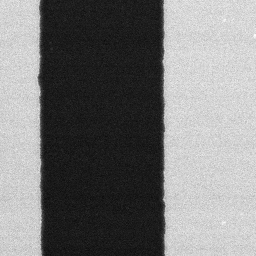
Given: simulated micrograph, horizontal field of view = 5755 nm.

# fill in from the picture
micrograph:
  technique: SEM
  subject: one or a few lines or trenches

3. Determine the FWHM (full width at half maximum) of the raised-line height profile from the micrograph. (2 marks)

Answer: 2.82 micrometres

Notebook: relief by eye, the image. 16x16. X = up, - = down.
--XXXXXXXX------
--XXXXXXXX------
--XXXXXXXX------
--XXXXXXXX------
--XXXXXXXX------
--XXXXXXXX------
--XXXXXXXX------
--XXXXXXXX------
--XXXXXXXX------
--XXXXXXXX------
---XXXXXXX------
--XXXXXXXX------
---XXXXXXX------
---XXXXXXX------
---XXXXXXX------
---XXXXXXX------